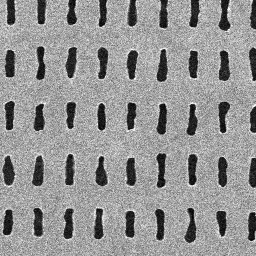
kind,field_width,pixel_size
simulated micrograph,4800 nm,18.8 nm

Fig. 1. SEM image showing a regular array of holes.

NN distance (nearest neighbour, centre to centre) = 0.567 micrometres